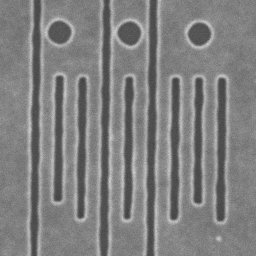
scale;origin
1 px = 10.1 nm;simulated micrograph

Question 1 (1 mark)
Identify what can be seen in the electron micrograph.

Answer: groups of lines, slits or small figures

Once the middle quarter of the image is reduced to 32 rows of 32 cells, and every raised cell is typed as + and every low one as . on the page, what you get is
+++++++++...+++++++++..+++++++++
+++++++++...+++++++++..+++++++++
+++++++++...+++++++++..+++++++++
++++..+++...++++.++++..++++..+++
++++..+++...+++...+++..++++..+++
+++...+++...+++...+++..++++..+++
+++...+++...+++...+++..++++..+++
++++..+++...+++...+++..++++..+++
+++...+++...+++...+++..++++..+++
+++...+++...+++..++++..++++..+++
+++...+++...+++..++++..++++..+++
+++...+++...+++..++++..++++..+++
+++...+++...+++..++++..++++..+++
+++...+++...+++..++++..++++..+++
+++...+++...+++..++++..++++..+++
+++...+++..++++..++++..++++..+++
+++...+++..++++..++++..++++..+++
++++..+++..++++..++++..+++...+++
++++..+++...+++..++++..+++...+++
++++..+++..++++..++++..++++..+++
+++...+++..++++..++++..++++..+++
+++...+++...+++..++++..++++..+++
+++...+++...+++..++++..++++..+++
+++...+++..++++..++++..++++..+++
+++...+++..++++..++++..++++..+++
+++...+++..++++..++++..++++..+++
+++...+++...+++..++++..++++..+++
+++...+++..++++..++++..++++..+++
+++...+++..++++..++++..++++..+++
+++...+++..++++..+++...++++..+++
+++...+++..++++..+++...++++..+++
+++...+++..++++..++++..++++..+++